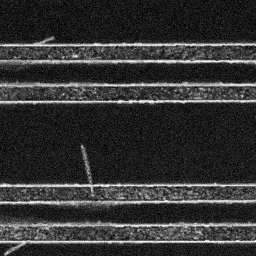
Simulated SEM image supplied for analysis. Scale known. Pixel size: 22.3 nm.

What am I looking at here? lines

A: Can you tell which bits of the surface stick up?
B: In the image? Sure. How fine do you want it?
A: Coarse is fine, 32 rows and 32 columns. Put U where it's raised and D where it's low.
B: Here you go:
UUUUUUUUUUUUUUUUUUUUUUUUUUUUUUUU
UUUUUUUUUUUUUUUUUUUUUUUUUUUUUUUU
UUUUUUUUUUUUUUUUUUUUUUUUUUUUUUUU
UUUUUUUUUUUUUUUUUUUUUUUUUUUUUUUU
UUUUUUUUUUUUUUUUUUUUUUUUUUUUUUUU
UUUUUUUUUUUUUUUUUUUUUUUUUUUUUUUU
DDDDDDDDDDDDDDDDDDDDDDDDDDDDDDDD
DDDDDDDDDDDDDDDDDDDDDDDDDDDDDDDD
UUUUUUUUUUUUUUUUUUUUUUUUUUUUUUUU
UUUUUUUUUUUUUUUUUUUUUUUUUUUUUUUU
UUUUUUUUUUUUUUUUUUUUUUUUUUUUUUUU
DDDDDDDDDDDDDDDDDDDDDDDDDDDDDDDD
DDDDDDDDDDDDDDDDDDDDDDDDDDDDDDDD
UUUUUUUUUUUUUUUUUUUUUUUUUUUUUUUU
UUUUUUUUUUUUUUUUUUUUUUUUUUUUUUUU
UUUUUUUUUUUUUUUUUUUUUUUUUUUUUUUU
UUUUUUUUUUUUUUUUUUUUUUUUUUUUUUUU
UUUUUUUUUUUUUUUUUUUUUUUUUUUUUUUU
UUUUUUUUUUUUUUUUUUUUUUUUUUUUUUUU
UUUUUUUUUUUUUUUUUUUUUUUUUUUUUUUU
UUUUUUUUUUUUUUUUUUUUUUUUUUUUUUUU
UUUUUUUUUUUUUUUUUUUUUUUUUUUUUUUU
UUUUUUUUUUUUUUUUUUUUUUUUUUUUUUUU
DDDDDDDDDDDDDDDDDDDDDDDDDDDDDDDD
DDDDDDDDDDDDDDDDDDDDDDDDDDDDDDDD
UUUUUUUUUUUUUUUUUUUUUUUUUUUUUUUU
UUUUUUUUUUUUUUUUUUUUUUUUUUUUUUUU
UUUUUUUUUUUUUUUUUUUUUUUUUUUUUUUU
DDDDDDDDDDDDDDDDDDDDDDDDDDDDDDDD
DDDDDDDDDDDDDDDDDDDDDDDDDDDDDDDD
UUUUUUUUUUUUUUUUUUUUUUUUUUUUUUUU
UUUUUUUUUUUUUUUUUUUUUUUUUUUUUUUU